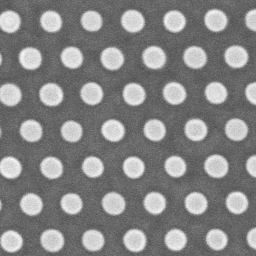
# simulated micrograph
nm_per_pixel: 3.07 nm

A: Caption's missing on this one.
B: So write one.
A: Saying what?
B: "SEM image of a regular array of raised bodies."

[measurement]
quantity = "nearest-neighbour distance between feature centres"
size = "125 nanometers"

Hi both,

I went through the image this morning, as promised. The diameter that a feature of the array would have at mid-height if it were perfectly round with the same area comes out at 67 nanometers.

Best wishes